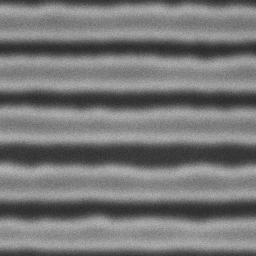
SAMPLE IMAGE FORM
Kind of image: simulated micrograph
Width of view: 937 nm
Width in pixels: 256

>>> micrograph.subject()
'lines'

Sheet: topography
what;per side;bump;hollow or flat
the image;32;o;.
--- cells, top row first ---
................................
oooooooooooooooooooooooooooooooo
oooooooooooooooooooooooooooooooo
oooooooooooooooooooooooooooooooo
oooooooooooooooooooooooooooooooo
................................
................................
ooooooooooooooooooooooooo..ooooo
oooooooooooooooooooooooooooooooo
oooooooooooooooooooooooooooooooo
oooooooooooooooooooooooooooooooo
................................
................................
oooo............................
oooooooooooooooooooooooooooooooo
oooooooooooooooooooooooooooooooo
oooooooooooooooooooooooooooooooo
oooooooooooooooooooooooooooooooo
................................
................................
................................
oooooooooooooooooooooooooooooooo
oooooooooooooooooooooooooooooooo
oooooooooooooooooooooooooooooooo
oooooooooooooooooooooooooooooooo
................................
................................
.o........oooo...ooooo.......ooo
oooooooooooooooooooooooooooooooo
oooooooooooooooooooooooooooooooo
oooooooooooooooooooooooooooooooo
................................